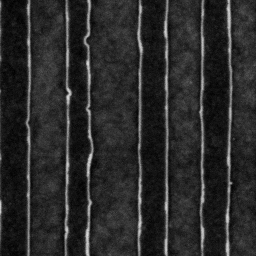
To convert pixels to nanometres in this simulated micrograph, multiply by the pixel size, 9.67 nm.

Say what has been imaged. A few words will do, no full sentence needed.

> one or a few lines or trenches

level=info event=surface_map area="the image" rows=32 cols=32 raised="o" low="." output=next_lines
oooo....ooo.......ooo....oooo...
oooo....ooo.......ooo....oooo...
oooo....ooo.......ooo....oooo...
oooo....ooo......oooo....oooo...
oooo....ooo......oooo....oooo...
oooo....ooo......oooo....oooo...
oooo....ooo.......ooo....oooo...
oooo....ooo.......ooo....oooo...
oooo....ooo......oooo....oooo...
oooo....ooo......oooo....oooo...
oooo....ooo......oooo....oooo...
oooo....ooo......oooo....oooo...
oooo....ooo......oooo....oooo...
ooo.....ooo......oooo....oooo...
oooo....ooo......oooo....oooo...
ooo......oo......oooo....oooo...
oooo....ooo......oooo....oooo...
oooo....ooo......oooo....oooo...
oooo....ooo......oooo....oooo...
oooo....ooo......oooo....oooo...
oooo....ooo......oooo....oooo...
oooo....ooo.......ooo....oooo...
oooo....ooo......oooo....oooo...
oooo....ooo......oooo....oooo...
oooo....ooo......oooo....oooo...
oooo....ooo......oooo....oooo...
oooo....ooo......oooo....ooo....
oooo....ooo......oooo....oooo...
oooo....ooo......oooo....ooo....
oooo....ooo......oooo....ooo....
oooo....ooo......oooo....oooo...
oooo....ooo......oooo....oooo...